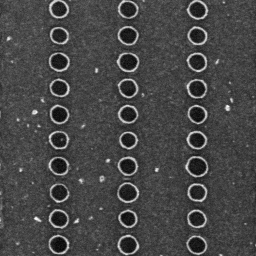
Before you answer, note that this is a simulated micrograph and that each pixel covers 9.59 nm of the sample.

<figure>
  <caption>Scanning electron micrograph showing a regular array of raised bodies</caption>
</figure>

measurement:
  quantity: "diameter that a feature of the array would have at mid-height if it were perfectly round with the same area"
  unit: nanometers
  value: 170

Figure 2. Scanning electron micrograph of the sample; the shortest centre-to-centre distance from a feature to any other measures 250 nanometres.